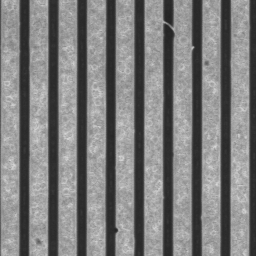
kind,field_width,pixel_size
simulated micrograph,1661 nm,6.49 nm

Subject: parallel lines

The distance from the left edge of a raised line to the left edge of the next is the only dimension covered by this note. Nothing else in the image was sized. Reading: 186 nm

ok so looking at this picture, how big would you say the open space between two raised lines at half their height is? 0.0535 um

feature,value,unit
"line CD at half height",0.131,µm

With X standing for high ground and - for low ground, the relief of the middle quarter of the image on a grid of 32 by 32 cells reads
XXX---XXXXX--XXXXX--XXXXX--XXXXX
XXX---XXXXX--XXXXX--XXXXX--XXXXX
XXX---XXXXX--XXXXX--XXXXX--XXXXX
XXX---XXXXX--XXXXX--XXXXX--XXXXX
XXX---XXXXX--XXXXX--XXXXX--XXXXX
XXX---XXXXX--XXXXX--XXXXX--XXXXX
XXX---XXXXX--XXXXX--XXXXX--XXXXX
XXX---XXXXX--XXXXX--XXXXX--XXXXX
XXX---XXXXX--XXXXX--XXXXX--XXXXX
XXX---XXXXX--XXXXX--XXXXX--XXXXX
XXX---XXXXX--XXXXX--XXXXX--XXXXX
XXX---XXXXX--XXXXX--XXXXX--XXXXX
XXX---XXXXX--XXXXX--XXXXX--XXXXX
XXX---XXXXX--XXXXX--XXXXX--XXXXX
XXX---XXXXX--XXXXX--XXXXX--XXXXX
XXX---XXXXX--XXXXX--XXXXX--XXXXX
XXX---XXXXX--XXXXX--XXXXX--XXXXX
XXX---XXXXX--XXXXX--XXXXX--XXXXX
XXX---XXXXX--XXXXX--XXXXX--XXXXX
XXX---XXXXX--XXXXX--XXXXX--XXXXX
XXX---XXXXX--XXXXX--XXXXX--XXXXX
XXX---XXXXX--XXXXX--XXXXX--XXXXX
XXX---XXXXX--XXXXX--XXXXX--XXXXX
XXX---XXXXX--XXXXX--XXXXX--XXXXX
XXX---XXXXX--XXXXX--XXXXX--XXXXX
XXX---XXXXX--XXXXX--XXXXX--XXXXX
XXX---XXXXX--XXXXX--XXXXX--XXXXX
XXX---XXXXX--XXXXX--XXXXX--XXXXX
XXX---XXXXX--XXXXX--XXXXX--XXXXX
XXX---XXXXX--XXXXX--XXXXX--XXXXX
XXX---XXXXX--XXXXX--XXXXX--XXXXX
XXX---XXXXX--XXXXX--XXXXX--XXXXX